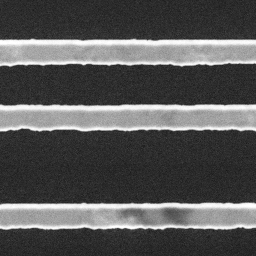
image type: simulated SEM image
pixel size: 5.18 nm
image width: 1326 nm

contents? lines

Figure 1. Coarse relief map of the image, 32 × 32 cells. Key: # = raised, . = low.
................................
................................
................................
................................
................................
################################
################################
################################
................................
................................
................................
................................
................................
################################
################################
################################
................................
................................
................................
................................
................................
................................
................................
................................
................................
................................
################################
################################
##...###...###..#..##....####...
................................
................................
................................